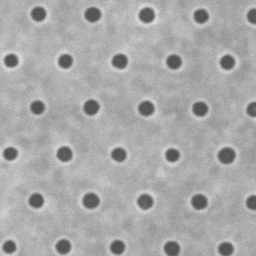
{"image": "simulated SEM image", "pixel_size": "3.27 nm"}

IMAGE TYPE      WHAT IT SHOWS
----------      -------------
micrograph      a regular array of holes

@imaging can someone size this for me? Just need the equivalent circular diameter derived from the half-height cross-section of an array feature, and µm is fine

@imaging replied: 0.058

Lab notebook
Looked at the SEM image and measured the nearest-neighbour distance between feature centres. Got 175 nm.